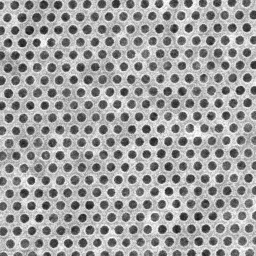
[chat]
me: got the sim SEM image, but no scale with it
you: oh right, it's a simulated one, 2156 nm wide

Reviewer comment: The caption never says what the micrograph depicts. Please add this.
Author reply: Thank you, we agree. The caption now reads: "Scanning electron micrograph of a regular array of holes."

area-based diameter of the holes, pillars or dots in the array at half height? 83.1 nm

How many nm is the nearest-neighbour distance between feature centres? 120